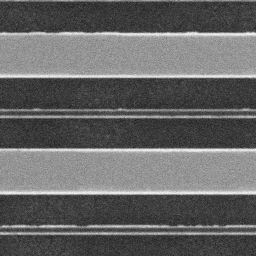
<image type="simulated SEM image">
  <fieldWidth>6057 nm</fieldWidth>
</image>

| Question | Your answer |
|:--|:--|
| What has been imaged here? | lines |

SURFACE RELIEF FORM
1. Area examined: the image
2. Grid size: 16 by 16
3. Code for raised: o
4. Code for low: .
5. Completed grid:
................
................
oooooooooooooooo
oooooooooooooooo
oooooooooooooooo
................
................
................
................
oooooooooooooooo
oooooooooooooooo
oooooooooooooooo
................
................
................
................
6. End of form